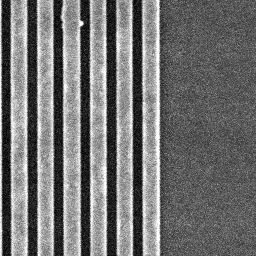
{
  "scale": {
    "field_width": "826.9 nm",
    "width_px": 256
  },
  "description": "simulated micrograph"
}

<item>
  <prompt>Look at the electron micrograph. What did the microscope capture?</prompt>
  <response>parallel lines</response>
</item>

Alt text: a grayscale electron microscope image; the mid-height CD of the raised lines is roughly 49.7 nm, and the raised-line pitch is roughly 85.3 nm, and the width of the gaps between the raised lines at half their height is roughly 37.2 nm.